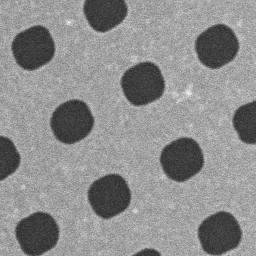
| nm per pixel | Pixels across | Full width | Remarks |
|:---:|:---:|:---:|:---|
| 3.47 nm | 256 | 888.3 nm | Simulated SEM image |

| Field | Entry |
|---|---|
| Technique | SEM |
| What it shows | holes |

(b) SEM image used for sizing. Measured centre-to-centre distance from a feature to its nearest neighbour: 282 nanometers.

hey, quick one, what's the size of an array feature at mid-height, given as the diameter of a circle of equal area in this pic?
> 154 nm